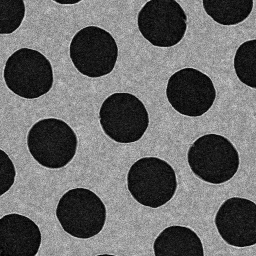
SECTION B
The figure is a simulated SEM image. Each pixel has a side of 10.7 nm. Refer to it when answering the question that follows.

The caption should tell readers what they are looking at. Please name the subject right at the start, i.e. a regular array of holes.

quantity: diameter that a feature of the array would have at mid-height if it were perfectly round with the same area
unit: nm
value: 532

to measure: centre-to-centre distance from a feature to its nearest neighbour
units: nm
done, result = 741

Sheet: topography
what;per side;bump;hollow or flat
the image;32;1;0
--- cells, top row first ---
00011111111111111100001110000000
00011111111111111000000111000001
00011111111111111000000111100011
00111111110011111000000111111111
11111111100000111100000111111111
11111111100000011110001111111100
11000111100000011111111111111100
10000011100000011111111111111000
10000011110000111111111011111000
10000001111001111111100000111100
10000001111111111111100000011110
11000011111111111111100000011111
11111111111110000111100000011111
11111111111110000011110000111111
11111111111100000001111101111111
11110000111110000001111111111111
11110000011110000011111111111111
11100000001111000111111110001111
11100000001111111111111100000111
01110000011111111111111000000011
00111000111111111000011100000011
00111111111111110000001100000011
00111111111111110000001110000111
01111111111111110000001111111111
11111111000011111000001111111111
11111110000001111100111111110000
11111110000001111111111111100000
00001110000001111111111111100000
00000111000001111111100111100000
00000111100011111111000001110000
00000111111111111110000001111000
00000111111111111110000001111111